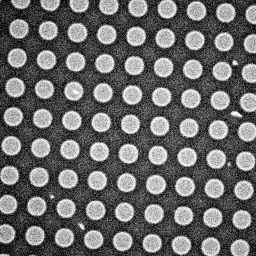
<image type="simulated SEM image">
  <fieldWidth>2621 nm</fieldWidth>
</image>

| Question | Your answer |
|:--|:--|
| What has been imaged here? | an array of small figures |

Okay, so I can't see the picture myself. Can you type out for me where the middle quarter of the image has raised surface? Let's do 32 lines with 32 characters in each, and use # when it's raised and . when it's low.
.####...####...#####...####...##
..##.....###....####...####...##
.................#.....###....##
................................
................................
.###....###.....................
#####...####...####....###......
#####...####...####...####....##
.###....####...####...#####...##
................##.....###....##
..............................##
................................
###......#......................
####...####....###.....##.......
####...####....####...####....##
####...####....####...####...###
........##.....###....####...###
.......................##.....##
................................
###.............................
###....###.....##...............
####...####...####....###.....##
###....####...####...#####...###
.#.....###....####...#####...###
...............##.....###....###
................................
................................
###....###......................
###...####....###....###......#.
###...####....####...####...####
##.....###....####...####...####
..............###....####...####